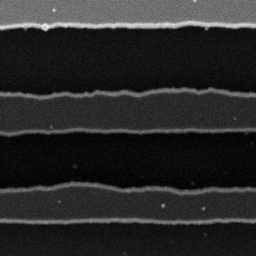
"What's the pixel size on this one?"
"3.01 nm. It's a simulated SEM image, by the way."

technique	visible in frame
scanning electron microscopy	lines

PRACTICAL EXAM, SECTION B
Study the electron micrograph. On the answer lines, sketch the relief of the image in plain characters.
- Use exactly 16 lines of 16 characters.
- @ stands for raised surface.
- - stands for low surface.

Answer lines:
@@@@@@@@@@@@@@@@
@@@@@@@@@@@@@@@@
----------------
----------------
----------------
----------------
@@@@@@@@@@@@@@@@
@@@@@@@@@@@@@@@@
----------------
----------------
----------------
----@@----------
@@@@@@@@@@@@@@@@
@@@@@@@@@@@@@@@@
----------------
----------------